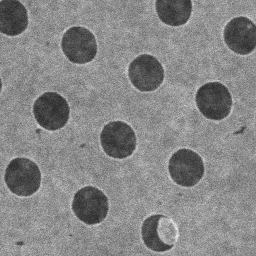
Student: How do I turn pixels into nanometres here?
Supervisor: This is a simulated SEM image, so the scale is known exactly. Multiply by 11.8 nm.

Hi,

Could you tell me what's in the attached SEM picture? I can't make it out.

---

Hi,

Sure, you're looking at a regular array of holes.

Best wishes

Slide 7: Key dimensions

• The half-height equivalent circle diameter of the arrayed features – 444 nanometers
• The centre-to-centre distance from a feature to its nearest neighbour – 71.6 px